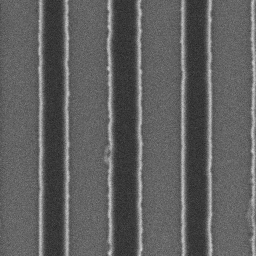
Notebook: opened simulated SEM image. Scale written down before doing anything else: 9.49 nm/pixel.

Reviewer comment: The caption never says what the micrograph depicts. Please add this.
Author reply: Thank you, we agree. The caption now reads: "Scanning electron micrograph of lines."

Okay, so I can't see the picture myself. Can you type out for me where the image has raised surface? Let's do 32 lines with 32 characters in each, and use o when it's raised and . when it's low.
.....ooo......oooo.....ooo......
.....ooo......oooo.....ooo......
.....ooo......oooo.....ooo......
.....ooo......oooo.....ooo......
.....oooo.....oooo.....ooo......
.....ooo......oooo.....ooo......
.....ooo......oooo.....ooo......
.....ooo......oooo.....ooo......
.....ooo......oooo.....ooo......
.....ooo......oooo.....ooo......
.....ooo......oooo.....ooo......
.....oooo.....oooo.....ooo......
.....ooo......oooo.....ooo......
.....ooo......oooo.....ooo......
.....ooo......oooo.....ooo......
.....ooo......oooo.....ooo......
.....ooo......oooo.....ooo......
.....oooo.....oooo.....ooo......
.....oooo.....oooo.....ooo......
.....oooo.....oooo.....ooo......
.....ooo......oooo.....ooo......
.....oooo.....oooo.....ooo......
.....oooo.....oooo.....ooo......
.....ooo......oooo.....ooo......
.....oooo.....oooo.....ooo......
.....ooo......oooo.....ooo......
.....ooo......oooo.....ooo......
.....ooo......oooo.....ooo......
.....ooo......oooo.....ooo......
.....ooo......oooo.....ooo......
.....ooo......oooo.....ooo......
.....ooo......oooo.....ooo......